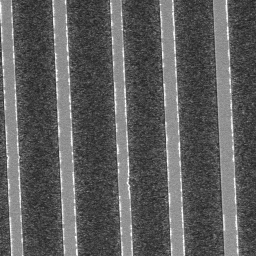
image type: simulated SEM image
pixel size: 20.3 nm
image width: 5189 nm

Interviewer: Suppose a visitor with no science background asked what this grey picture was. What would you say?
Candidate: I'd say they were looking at parallel lines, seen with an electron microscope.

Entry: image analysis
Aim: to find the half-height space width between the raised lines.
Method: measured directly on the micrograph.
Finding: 36.6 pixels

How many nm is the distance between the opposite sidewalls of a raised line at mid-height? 271